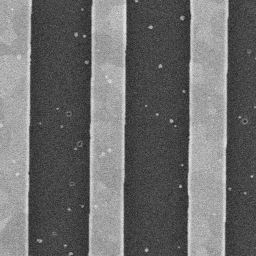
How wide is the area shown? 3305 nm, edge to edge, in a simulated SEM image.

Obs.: lines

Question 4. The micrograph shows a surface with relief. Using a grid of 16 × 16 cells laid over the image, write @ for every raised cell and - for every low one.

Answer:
@@----@@----@@--
@@----@@----@@--
@@----@@----@@--
@@----@@----@@--
@@----@@----@@--
@@----@@----@@--
@@----@@----@@--
@@----@@----@@--
@@----@@----@@--
@@----@@----@@--
@@----@@----@@--
@@----@@----@@--
@@----@@----@@--
@@----@@----@@--
@@----@@----@@--
@@----@@----@@--